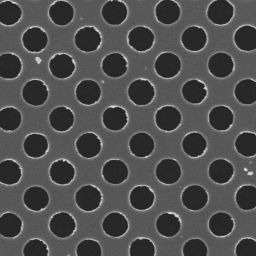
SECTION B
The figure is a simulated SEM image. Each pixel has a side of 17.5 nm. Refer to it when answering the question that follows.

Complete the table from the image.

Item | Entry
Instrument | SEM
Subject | a regular array of holes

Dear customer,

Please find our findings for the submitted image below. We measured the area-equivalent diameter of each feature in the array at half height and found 436 nm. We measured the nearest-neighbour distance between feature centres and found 652 nm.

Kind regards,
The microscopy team